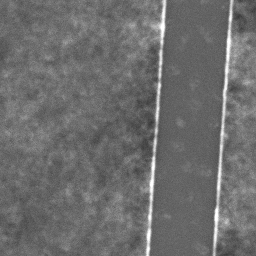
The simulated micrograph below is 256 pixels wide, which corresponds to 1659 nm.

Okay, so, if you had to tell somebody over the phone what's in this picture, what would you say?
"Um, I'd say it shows one or a few lines or trenches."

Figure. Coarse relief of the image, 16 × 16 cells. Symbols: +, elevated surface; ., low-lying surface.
++++++++++....++
++++++++++....++
++++++++++....++
++++++++++....++
++++++++++....++
++++++++++....++
++++++++++....++
++++++++++....++
++++++++++....++
++++++++++....++
++++++++++....++
++++++++++....++
+++++++++.....++
+++++++++....+++
+++++++++....+++
+++++++++....+++